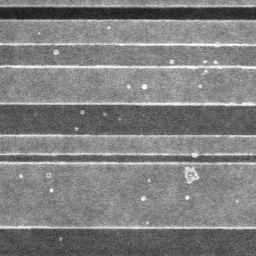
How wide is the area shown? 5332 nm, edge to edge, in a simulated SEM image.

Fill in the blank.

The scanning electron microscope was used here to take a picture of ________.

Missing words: lines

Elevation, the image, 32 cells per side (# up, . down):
################################
................................
................................
################################
################################
################################
################################
################################
################################
################################
################################
################################
################################
................................
................................
................................
................................
################################
################################
################################
################################
################################
################################
################################
################################
################################
################################
################################
................................
................................
................................
................................